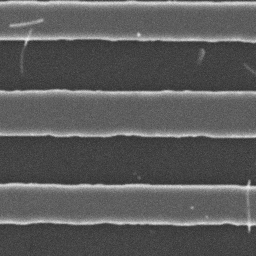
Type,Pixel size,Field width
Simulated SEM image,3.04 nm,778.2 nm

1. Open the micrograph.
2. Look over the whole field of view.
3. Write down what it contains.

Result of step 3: lines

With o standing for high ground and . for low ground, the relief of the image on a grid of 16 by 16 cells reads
oooooooooooooooo
oooooooooooooooo
.o.....ooooooooo
................
................
................
oooooooooooooooo
oooooooooooooooo
...oooo..ooooooo
................
................
oo..............
oooooooooooooooo
oooooooooooooooo
................
................